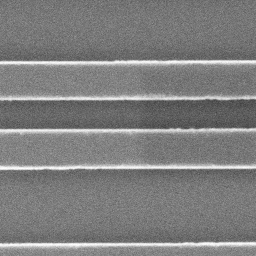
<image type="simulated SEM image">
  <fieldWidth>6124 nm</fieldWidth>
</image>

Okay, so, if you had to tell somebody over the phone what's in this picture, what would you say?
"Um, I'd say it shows lines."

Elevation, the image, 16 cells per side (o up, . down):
................
................
................
................
oooooooooooooooo
oooooooooooooooo
................
................
oooooooooooooooo
oooooooooooooooo
.oo.............
................
................
................
................
oooooooooooooooo